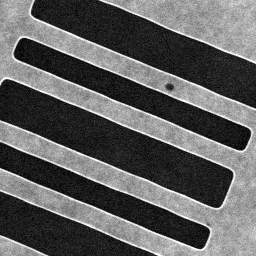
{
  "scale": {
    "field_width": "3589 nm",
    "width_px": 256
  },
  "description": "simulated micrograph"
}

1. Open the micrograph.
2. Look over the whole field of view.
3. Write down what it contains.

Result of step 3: groups of lines, slits or small figures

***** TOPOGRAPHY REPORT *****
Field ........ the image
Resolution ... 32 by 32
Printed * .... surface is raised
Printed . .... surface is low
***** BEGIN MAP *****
****..........******************
****............****************
*****..............*************
*******..............***********
**********.............*********
**...*******..............******
**......******..............****
**........*******..............*
*****........******.............
*******........*******..........
...******.........******........
.....*******........*******.....
........******........*******...
..........*******........*******
.............******........*****
*..............*******........**
****.............*******.......*
******..............******.....*
..*******.............*******..*
....*******..............*******
.......******..............*****
*........*******.............***
****.......*******...........***
******........*******........***
..******.........******.....****
....*******........******...****
.......******........***********
.........*******........********
............******........******
..............******......******
***.............*******...******
*****..............*************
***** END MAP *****